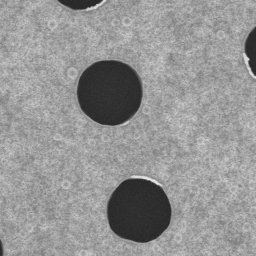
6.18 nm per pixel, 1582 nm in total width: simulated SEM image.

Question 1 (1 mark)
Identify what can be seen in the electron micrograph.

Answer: holes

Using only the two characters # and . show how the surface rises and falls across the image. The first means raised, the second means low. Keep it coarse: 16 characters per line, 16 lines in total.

################
################
###############.
###############.
#####...########
#####....#######
#####....#######
######..########
################
################
################
########..######
#######....#####
#######....#####
#######...######
################